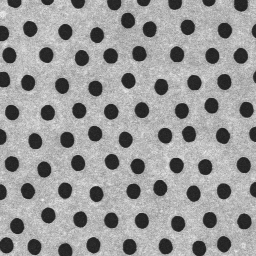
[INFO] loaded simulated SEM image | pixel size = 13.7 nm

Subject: a regular array of holes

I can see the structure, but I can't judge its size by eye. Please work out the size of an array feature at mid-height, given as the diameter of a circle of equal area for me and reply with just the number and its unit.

207 nm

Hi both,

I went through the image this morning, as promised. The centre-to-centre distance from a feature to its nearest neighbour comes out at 393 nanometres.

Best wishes